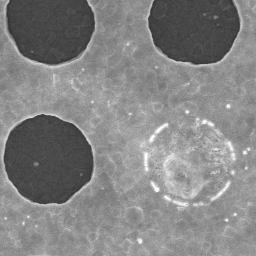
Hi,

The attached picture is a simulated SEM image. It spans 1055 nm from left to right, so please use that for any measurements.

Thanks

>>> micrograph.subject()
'holes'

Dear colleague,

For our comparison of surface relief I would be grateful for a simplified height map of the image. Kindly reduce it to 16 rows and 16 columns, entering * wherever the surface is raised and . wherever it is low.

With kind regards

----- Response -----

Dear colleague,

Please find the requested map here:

......***......*
......***......*
*.....****.....*
**...*****....**
****************
****************
****************
**..************
*....***********
......**********
......**********
*....***********
**..************
****************
****************
****************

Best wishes